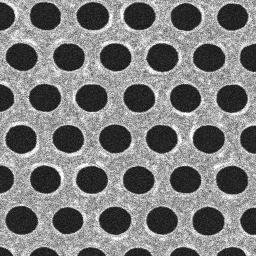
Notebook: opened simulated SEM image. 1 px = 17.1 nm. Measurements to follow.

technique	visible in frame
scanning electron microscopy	a regular array of holes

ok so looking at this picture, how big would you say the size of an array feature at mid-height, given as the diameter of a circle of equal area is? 516 nm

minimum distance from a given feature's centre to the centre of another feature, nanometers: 795